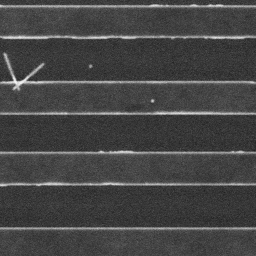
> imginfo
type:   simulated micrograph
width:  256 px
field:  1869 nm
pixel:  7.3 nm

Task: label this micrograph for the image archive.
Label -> lines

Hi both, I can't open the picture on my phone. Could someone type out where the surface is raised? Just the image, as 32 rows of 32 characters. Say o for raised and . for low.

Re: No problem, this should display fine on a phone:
................................
oooooooooooooooooooooooooooooooo
oooooooooooooooooooooooooooooooo
oooooooooooooooooooooooooooooooo
oooooooooooooooooooooooooooooooo
................................
................................
................................
................................
................................
oooooooooooooooooooooooooooooooo
oooooooooooooooooooooooooooooooo
oooooooooooooooooooooooooooooooo
oooooooooooooooooooooooooooooooo
................................
................................
................................
................................
................................
oooooooooooooooooooooooooooooooo
oooooooooooooooooooooooooooooooo
oooooooooooooooooooooooooooooooo
oooooooooooooooooooooooooooooooo
................................
................................
................................
................................
................................
................................
oooooooooooooooooooooooooooooooo
oooooooooooooooooooooooooooooooo
oooooooooooooooooooooooooooooooo